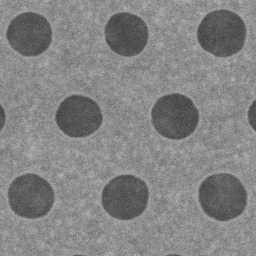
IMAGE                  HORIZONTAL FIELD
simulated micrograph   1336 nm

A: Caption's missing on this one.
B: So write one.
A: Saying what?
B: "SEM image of a regular array of holes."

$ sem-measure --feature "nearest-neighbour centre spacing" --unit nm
488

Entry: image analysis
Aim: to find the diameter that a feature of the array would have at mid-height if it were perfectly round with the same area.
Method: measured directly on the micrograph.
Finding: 243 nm